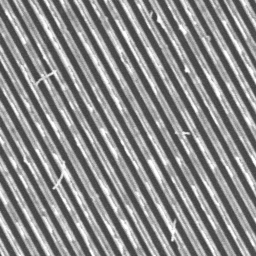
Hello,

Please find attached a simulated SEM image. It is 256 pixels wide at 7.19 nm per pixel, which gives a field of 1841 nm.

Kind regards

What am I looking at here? parallel lines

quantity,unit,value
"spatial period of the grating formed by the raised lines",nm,95.3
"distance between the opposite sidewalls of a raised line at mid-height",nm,42.6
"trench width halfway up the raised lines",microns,0.0505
